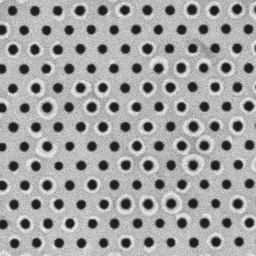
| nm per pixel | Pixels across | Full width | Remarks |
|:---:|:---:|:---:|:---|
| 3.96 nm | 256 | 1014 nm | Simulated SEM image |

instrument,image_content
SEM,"a regular array of holes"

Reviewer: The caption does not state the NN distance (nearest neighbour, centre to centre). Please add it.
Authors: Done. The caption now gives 86.8 nanometers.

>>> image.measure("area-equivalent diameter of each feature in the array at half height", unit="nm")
36.1